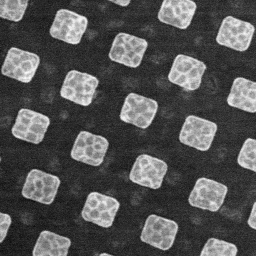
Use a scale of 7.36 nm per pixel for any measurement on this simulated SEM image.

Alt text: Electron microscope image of a regular array of raised bodies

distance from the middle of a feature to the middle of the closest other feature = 0.454 microns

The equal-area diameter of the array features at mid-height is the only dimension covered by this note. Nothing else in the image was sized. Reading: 245 nm